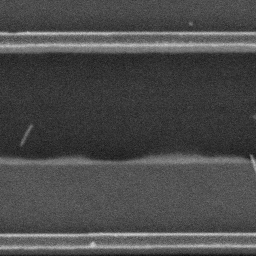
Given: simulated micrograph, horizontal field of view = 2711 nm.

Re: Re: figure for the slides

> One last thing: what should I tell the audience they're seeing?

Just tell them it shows lines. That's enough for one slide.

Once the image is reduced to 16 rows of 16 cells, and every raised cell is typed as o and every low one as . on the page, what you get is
oooooooooooooooo
oooooooooooooooo
oooooooooooooooo
................
................
................
................
................
................
................
oooooooooooooooo
oooooooooooooooo
oooooooooooooooo
oooooooooooooooo
oooooooooooooooo
oooooooooooo....